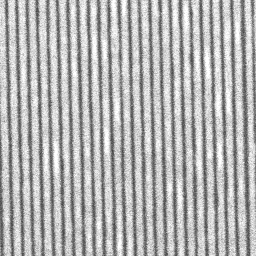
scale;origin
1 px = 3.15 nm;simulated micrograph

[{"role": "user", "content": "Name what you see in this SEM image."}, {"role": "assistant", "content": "parallel lines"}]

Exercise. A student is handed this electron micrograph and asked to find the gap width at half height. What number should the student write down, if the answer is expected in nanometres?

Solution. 11.4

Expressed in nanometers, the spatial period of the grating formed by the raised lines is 32.3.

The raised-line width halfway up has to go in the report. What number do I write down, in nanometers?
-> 20.1